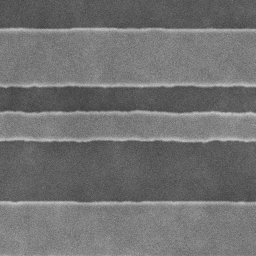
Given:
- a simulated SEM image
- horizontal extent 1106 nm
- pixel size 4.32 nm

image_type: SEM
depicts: lines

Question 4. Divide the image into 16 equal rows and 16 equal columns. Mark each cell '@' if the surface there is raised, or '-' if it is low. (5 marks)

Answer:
----------------
----------------
@@@@@@@@@@@@@@@@
@@@@@@@@@@@@@@@@
@@@@@@@@@@@@@@@@
----------------
----------------
@@@@@@@@@@@@@@@@
@@@@@@@@@@@@@@@@
----------------
----------------
----------------
----------------
@@@@@@@@@@@@@@@@
@@@@@@@@@@@@@@@@
@@@@@@@@@@@@@@@@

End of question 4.